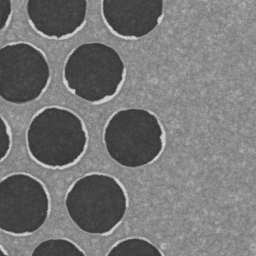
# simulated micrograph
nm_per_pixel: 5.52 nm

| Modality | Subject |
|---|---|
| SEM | holes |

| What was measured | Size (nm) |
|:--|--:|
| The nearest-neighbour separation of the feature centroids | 420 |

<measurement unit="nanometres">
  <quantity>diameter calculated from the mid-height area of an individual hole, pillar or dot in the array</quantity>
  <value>319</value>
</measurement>